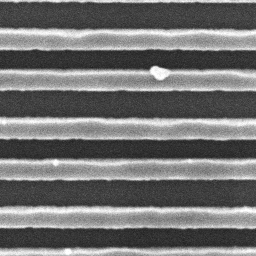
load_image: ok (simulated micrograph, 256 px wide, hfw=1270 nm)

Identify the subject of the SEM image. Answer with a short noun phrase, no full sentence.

lines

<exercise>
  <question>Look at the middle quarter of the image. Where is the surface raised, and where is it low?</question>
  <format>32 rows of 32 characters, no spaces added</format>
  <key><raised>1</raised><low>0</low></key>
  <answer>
00000000000000000000000000000000
00000000000000000000011111000000
11111111111111111111111111111111
11111111111111111111111111111111
11111111111111111111111111111111
11111111111111111111111111111111
10111111111111011111111111111111
00000000000000000000000000000000
00000000000000000000000000000000
00000000000000000000000000000000
00000000000000000000000000000000
00000000000000000000000000000000
00000000000000000000000000000000
00000000000000000000000000000000
11111111111111111111111111111111
11111111111111111111111111111111
11111111111111111111111111111111
11111111111111111111111111111111
11011111111111111111111111111111
00000000000000000000000000000000
00000000000000000000000000000000
00000000000000000000000000000000
00000000000000000000000000000000
00000000000000000000000000000000
11111111111111111111111111111111
11111111111111111111111111111111
11111111111111111111111111111111
11111111111111111111111111111111
11111111111111111111111111111111
00000000000000000000000000000000
00000000000000000000000000000000
00000000000000000000000000000000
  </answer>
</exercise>